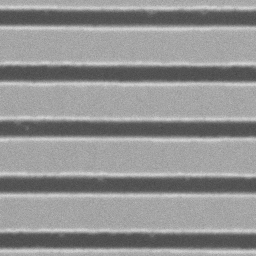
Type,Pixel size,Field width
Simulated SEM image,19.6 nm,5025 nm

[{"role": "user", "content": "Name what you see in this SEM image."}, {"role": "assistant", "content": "lines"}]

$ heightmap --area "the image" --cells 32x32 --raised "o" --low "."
oooooooooooooooooooooooooooooooo
................................
................................
oooooooooooooooooooooooooooooooo
oooooooooooooooooooooooooooooooo
oooooooooooooooooooooooooooooooo
oooooooooooooooooooooooooooooooo
oooooooooooooooooooooooooooooooo
................................
................................
oooooooooooooooooooooooooooooooo
oooooooooooooooooooooooooooooooo
oooooooooooooooooooooooooooooooo
oooooooooooooooooooooooooooooooo
oooooooooooooooooooooooooooooooo
................................
................................
oooooooooooooooooooooooooooooooo
oooooooooooooooooooooooooooooooo
oooooooooooooooooooooooooooooooo
oooooooooooooooooooooooooooooooo
oooooooooooooooooooooooooooooooo
................................
................................
oooooooooooooooooooooooooooooooo
oooooooooooooooooooooooooooooooo
oooooooooooooooooooooooooooooooo
oooooooooooooooooooooooooooooooo
oooooooooooooooooooooooooooooooo
................................
................................
oooooooooooooooooooooooooooooooo